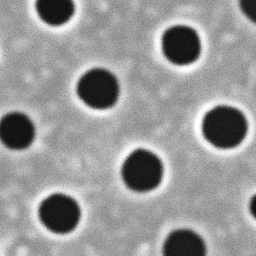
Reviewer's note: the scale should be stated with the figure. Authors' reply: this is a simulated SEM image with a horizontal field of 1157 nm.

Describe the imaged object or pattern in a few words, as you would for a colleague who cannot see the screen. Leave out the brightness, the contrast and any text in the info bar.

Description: holes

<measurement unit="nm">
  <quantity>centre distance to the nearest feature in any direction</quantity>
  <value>420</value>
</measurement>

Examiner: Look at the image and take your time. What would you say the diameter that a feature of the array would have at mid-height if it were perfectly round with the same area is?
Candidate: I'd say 200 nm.